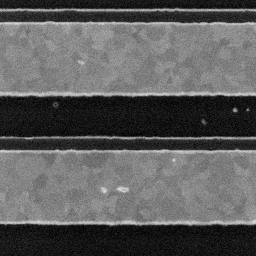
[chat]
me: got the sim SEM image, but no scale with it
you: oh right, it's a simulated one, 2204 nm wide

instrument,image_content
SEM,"lines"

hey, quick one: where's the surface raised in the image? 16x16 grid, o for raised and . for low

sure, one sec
................
oooooooooooooooo
oooooooooooooooo
oooooooooooooooo
oooooooooooooooo
oooooooooooooooo
................
................
................
oooooooooooooooo
oooooooooooooooo
oooooooooooooooo
oooooooooooooooo
oooooooooooooooo
................
................